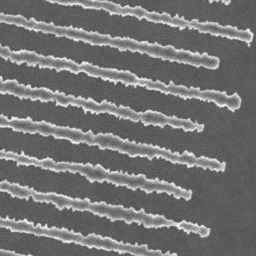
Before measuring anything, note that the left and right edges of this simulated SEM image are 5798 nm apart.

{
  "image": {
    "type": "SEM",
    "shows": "parallel lines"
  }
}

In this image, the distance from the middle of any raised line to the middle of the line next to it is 753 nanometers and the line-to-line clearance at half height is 498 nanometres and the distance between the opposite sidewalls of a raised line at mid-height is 230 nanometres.